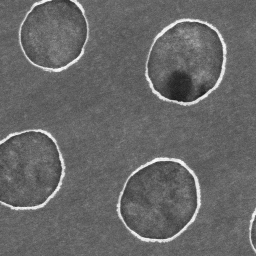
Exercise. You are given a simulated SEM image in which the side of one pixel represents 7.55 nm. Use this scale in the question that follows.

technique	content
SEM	holes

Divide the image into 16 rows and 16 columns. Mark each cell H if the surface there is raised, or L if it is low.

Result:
HHLLLHHHHHHHHHHH
HLLLLHHHHHHLLHHH
HLLLLHHHHHLLLLHH
HHLLLHHHHLLLLLHH
HHHHHHHHHLLLLLHH
HHHHHHHHHHLLLHHH
HHHHHHHHHHHHHHHH
HHHHHHHHHHHHHHHH
HLLHHHHHHHHHHHHH
LLLLHHHHHHHHHHHH
LLLLHHHHHLLLHHHH
LLLLHHHHLLLLHHHH
LLLHHHHHLLLLHHHH
HHHHHHHHLLLLHHHH
HHHHHHHHLLLHHHHH
HHHHHHHHHHHHHHHH